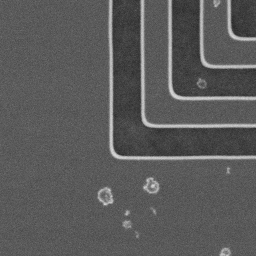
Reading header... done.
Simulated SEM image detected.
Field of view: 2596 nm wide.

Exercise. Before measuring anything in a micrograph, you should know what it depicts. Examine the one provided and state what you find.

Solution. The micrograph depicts groups of lines, slits or small figures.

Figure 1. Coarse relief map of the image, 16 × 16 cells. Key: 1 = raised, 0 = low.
1111111001100100
1111111001100100
1111111001100111
1111111001100111
1111111001100000
1111111001100000
1111111001111111
1111111001111111
1111111000000000
1111111000000000
1111111111111111
1111111111111111
1111111111111111
1111111111111111
1111111111111111
1111111111111111